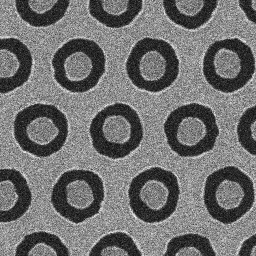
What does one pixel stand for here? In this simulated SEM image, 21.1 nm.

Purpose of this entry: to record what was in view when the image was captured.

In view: a regular array of ring-shaped raised bodies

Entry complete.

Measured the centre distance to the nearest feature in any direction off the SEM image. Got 1570 nanometers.